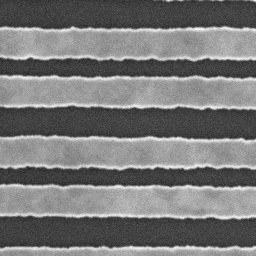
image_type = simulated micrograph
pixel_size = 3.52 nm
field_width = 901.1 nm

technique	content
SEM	lines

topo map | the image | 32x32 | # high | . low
................................
................................
................................
#.........................##....
################################
################################
################################
............#.#..#..##..#.....#.
................................
................................
################################
################################
################################
.........................#..####
................................
................................
................................
################################
################################
################################
################################
................................
................................
################################
################################
################################
################################
................................
................................
................................
................................
################################